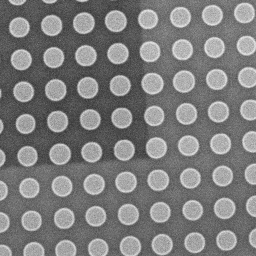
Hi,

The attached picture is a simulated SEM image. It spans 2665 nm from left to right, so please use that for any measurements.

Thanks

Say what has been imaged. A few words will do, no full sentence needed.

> an array of small figures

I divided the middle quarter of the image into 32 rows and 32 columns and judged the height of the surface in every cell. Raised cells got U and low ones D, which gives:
DDDDDDDDDDDDDDDDDDDDDDDDDDDDDDDD
DDDDDDDDDDDDDDDDDDDDDDDDDDDDDDDD
DDDDDDDDDDDDDDDDDDDDDUUDDDDDUUUU
DDDDDUUDDDDDDUUUDDDDUUUUDDDDUUUU
DDDDUUUUDDDDUUUUDDDUUUUUUDDUUUUU
DDDUUUUUDDDDUUUUUDDUUUUUUDDDUUUU
DDDUUUUUDDDDUUUUDDDDUUUUDDDDUUUD
DDDDUUUUDDDDDUUDDDDDDDDDDDDDDDDD
DDDDDUUDDDDDDDDDDDDDDDDDDDDDDDDD
DDDDDDDDDDDDDDDDDDDDDDDDDDDDDDDD
DDDDDDDDDDDDDDDDDDDDDDDDDDDDDUUU
DDDDDDUDDDDDDUUUDDDDDUUUDDDDUUUU
DDDDDUUUUDDDUUUUUDDDUUUUUDDDUUUU
UDDDUUUUUDDDUUUUUDDDUUUUUDDDUUUU
UDDDUUUUUDDDUUUUUDDDDUUUDDDDDUUU
UDDDDUUUDDDDDUUUDDDDDDDDDDDDDDDD
DDDDDDDDDDDDDDDDDDDDDDDDDDDDDDDD
DDDDDDDDDDDDDDDDDDDDDDDDDDDDDDDD
DDDDDDDDDDDDDDDDDDDDDDUDDDDDDUUU
DDDDDDDDDDDDDDUUDDDDDUUUUDDDDUUU
UDDDDUUUUDDDDUUUUDDDDUUUUUDDDUUU
UUDDUUUUUDDDDUUUUUDDDUUUUUDDDUUU
UUDDDUUUUDDDDUUUUDDDDUUUUDDDDDUU
UDDDDUUUUDDDDUUUUDDDDDUDDDDDDDDD
UDDDDDUDDDDDDDDDDDDDDDDDDDDDDDDD
DDDDDDDDDDDDDDDDDDDDDDDDDDDDDDDD
DDDDDDDDDDDDDDDDDDDDDDDDDDDDDDUU
DDDDDDDDDDDDDDUUUDDDDUUUUUDDDUUU
UDDDDDUUUUDDDUUUUUDDDUUUUUDDDUUU
UUDDDUUUUUDDDUUUUUDDDUUUUUDDDUUU
UUDDDUUUUUDDDUUUUUDDDDUUUUDDDDUU
UUDDDUUUUUDDDDUUUDDDDDDUDDDDDDDD